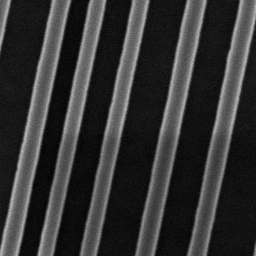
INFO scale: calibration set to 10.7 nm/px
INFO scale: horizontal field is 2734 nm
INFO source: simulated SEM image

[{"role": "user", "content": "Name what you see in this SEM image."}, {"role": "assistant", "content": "lines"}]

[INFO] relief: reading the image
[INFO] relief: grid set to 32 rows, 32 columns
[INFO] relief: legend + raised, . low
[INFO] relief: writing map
+.....+++..++...+++....+++....++
+.....++...++...++.....++.....++
+.....++...++...++.....++.....++
+.....++...++...++.....++....+++
......++..++....++.....++....+++
.....+++..++...+++....+++....++.
.....++...++...++.....++.....++.
.....++...++...++.....++....+++.
.....++...++...++.....++....+++.
....+++..++....++.....++....++..
....+++..++...++.....+++....++..
....++...++...++.....+++....++..
....++...++...++.....++....+++..
....++...++...++.....++....+++..
...+++..++....++.....++....++...
...+++..++...++.....+++....++...
...++...++...++.....++.....++...
...++...++...++.....++....+++...
...++..++....++.....++....+++...
...++..++....++....+++....++....
..+++..++...++.....+++....++....
..++...++...++.....++.....++....
..++...++...++.....++....+++....
..++..++....++.....++....++.....
.+++..++....++....+++....++.....
.+++..++...++.....+++....++.....
.++...++...++.....++.....++.....
.++...++...++.....++....+++.....
.++..++....++.....++....++......
+++..++....++....+++....++......
+++..++...++.....+++....++......
++...++...++.....++.....++......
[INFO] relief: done